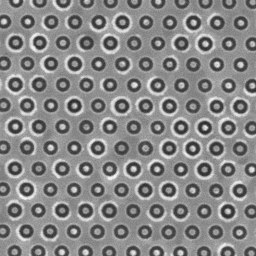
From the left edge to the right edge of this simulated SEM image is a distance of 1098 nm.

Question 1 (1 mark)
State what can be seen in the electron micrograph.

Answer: a regular array of ring-shaped grooves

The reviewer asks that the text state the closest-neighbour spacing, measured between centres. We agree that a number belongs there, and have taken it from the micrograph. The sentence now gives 0.101 µm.